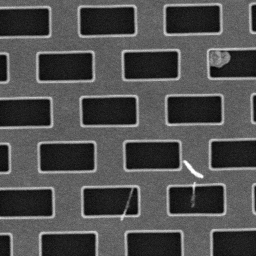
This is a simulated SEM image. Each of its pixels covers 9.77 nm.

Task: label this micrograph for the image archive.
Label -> groups of lines, slits or small figures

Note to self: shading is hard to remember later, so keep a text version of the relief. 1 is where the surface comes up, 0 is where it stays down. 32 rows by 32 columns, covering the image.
11111111111111111111111111111111
00000011110000000111100000001110
00000011110000000111100000001110
00000011110000000111100000001110
00000011111000111111111111111111
11111111111111111111111111111111
11111111111111110000001111100000
01111000000011100000001111100000
01111000000011100000001111000000
01111000000011110000001111000000
11111111111111111111111111111111
11111111111111111111111111111111
00000011110000000111100000001110
00000011110000000111100000001110
00000011110000000111100000001111
00000011110000000111100000111111
11111111111111111111111111111111
11111111111111111111111111110000
01111000000011110000001111000000
01111000000011110000000111000000
01111000000011110000000111000000
01111000011111111111111111111111
11111111111111111111111111111111
11111111111000000111100000001111
00000001110000000111100000001111
00000001110000000111100000001111
00000001110000000111100000001111
11111111111111111111111111111111
11111111111111111111111111111111
01111000000011110000000111000000
01111000000011110000000111000000
01111000000011110000000111000000